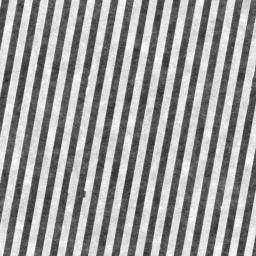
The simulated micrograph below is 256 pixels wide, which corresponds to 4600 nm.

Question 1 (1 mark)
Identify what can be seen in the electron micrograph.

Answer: parallel lines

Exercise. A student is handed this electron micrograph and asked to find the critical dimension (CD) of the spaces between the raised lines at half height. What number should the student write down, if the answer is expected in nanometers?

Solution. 137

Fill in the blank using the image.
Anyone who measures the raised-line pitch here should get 276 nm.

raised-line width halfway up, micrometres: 0.137